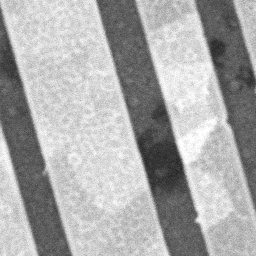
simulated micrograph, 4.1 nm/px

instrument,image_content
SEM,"one or a few lines or trenches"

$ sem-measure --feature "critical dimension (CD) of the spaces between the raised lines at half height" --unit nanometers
166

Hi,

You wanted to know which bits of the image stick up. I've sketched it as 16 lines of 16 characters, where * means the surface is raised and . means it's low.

******...***...*
******...***...*
.******..****..*
.******...***...
.******...***...
..*****...****..
..******..****..
..******...***..
..******...***..
...******..****.
*..******...***.
*..******...***.
*...*****...****
**..******..****
**..******...***
**..******...***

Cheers